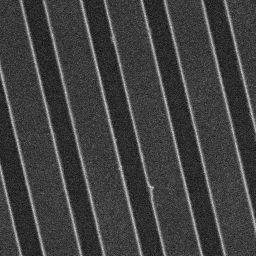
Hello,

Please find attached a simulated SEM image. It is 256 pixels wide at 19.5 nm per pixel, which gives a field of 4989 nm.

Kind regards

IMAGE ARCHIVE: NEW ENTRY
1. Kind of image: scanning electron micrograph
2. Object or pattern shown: parallel lines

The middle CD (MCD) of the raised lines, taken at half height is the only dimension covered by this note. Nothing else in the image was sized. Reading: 35.6 px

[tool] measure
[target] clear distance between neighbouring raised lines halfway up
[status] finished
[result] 0.444 µm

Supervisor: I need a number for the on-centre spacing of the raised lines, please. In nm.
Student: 1140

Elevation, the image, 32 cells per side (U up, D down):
UUUDDDUUUUDDDUUUUUDDDUUUUDDDUUUU
UUUDDDUUUUDDDUUUUUDDDUUUUUDDUUUU
UUUDDDUUUUUDDDUUUUDDDUUUUUDDDUUU
UUUDDDUUUUUDDDUUUUUDDUUUUUDDDUUU
UUUUDDDUUUUDDDUUUUUDDDUUUUDDDUUU
UUUUDDDUUUUDDDUUUUUDDDUUUUDDDUUU
UUUUDDDUUUUUDDDUUUUDDDUUUUUDDDUU
UUUUDDDUUUUUDDDUUUUDDDUUUUUDDDUU
UUUUUDDDUUUUDDDUUUUUDDDUUUUDDDUU
UUUUUDDDUUUUDDDUUUUUDDDUUUUDDDUU
UUUUUDDDUUUUUDDDUUUUDDDUUUUUDDDU
DUUUUDDDUUUUUDDDUUUUDDDUUUUUDDDU
DUUUUUDDUUUUUDDDUUUUUDDDUUUUDDDU
DUUUUUDDDUUUUDDDUUUUUDDDUUUUDDDU
DUUUUUDDDUUUUUDDUUUUUDDDUUUUUDDD
DDUUUUDDDUUUUUDDDUUUUDDDUUUUUDDD
DDUUUUDDDUUUUUDDDUUUUUDDDUUUUDDD
DDUUUUUDDDUUUUDDDUUUUUDDDUUUUDDD
DDUUUUUDDDUUUUDDDUUUUUDDDUUUUUDD
DDDUUUUDDDUUUUUDDDUUUUDDDUUUUUDD
DDDUUUUDDDUUUUUDDDUUUUUDDUUUUUDD
DDDUUUUUDDDUUUUDDDUUUUUDDDUUUUDD
DDDUUUUUDDDUUUUDDDUUUUUDDDUUUUDD
UDDDUUUUDDDUUUUUDDDUUUUDDDUUUUUD
UDDDUUUUDDDUUUUUDDDUUUUDDDUUUUUD
UDDDUUUUUDDDUUUUDDDUUUUUDDDUUUUD
UDDDUUUUUDDDUUUUDDDUUUUUDDDUUUUD
UUDDUUUUUDDDUUUUUDDDUUUUDDDUUUUU
UUDDDUUUUDDDUUUUUDDDUUUUDDDUUUUU
UUDDDUUUUUDDUUUUUDDDUUUUUDDDUUUU
UUDDDUUUUUDDDUUUUDDDUUUUUDDDUUUU
UUUDDUUUUUDDDUUUUUDDUUUUUDDDUUUU